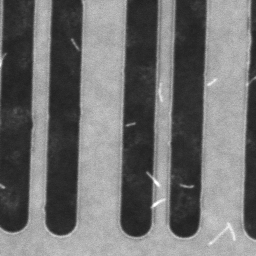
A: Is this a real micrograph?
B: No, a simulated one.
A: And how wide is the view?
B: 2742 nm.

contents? one or a few lines or trenches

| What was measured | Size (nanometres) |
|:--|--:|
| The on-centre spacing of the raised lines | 647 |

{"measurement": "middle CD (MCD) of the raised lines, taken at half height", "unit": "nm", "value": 368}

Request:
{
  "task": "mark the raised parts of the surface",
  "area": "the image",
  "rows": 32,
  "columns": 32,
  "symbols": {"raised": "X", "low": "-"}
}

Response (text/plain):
XXXX--XXXX------XXXX--XXXX-----X
XXXX--XXXX------XXXX--XXXX-----X
XXXX--XXXX------XXXX--XXXX-----X
XXXX--XXXX------XXXX--XXXX-----X
XXXX--XXXX------XXXX--XXXX-----X
XXXX--XXXX------XXXX--XXXX-----X
XXXX--XXXX------XXXX--XXXX-----X
XXXX--XXXX-----XXXXX--XXXX-----X
XXXX--XXXX-----XXXXX-XXXXX-----X
XXXX--XXXX-----XXXXX-XXXXX-----X
XXXX--XXXX-----XXXXX-XXXXX-----X
XXXX--XXXX-----XXXXX-XXXXX-----X
XXXX--XXXX-----XXXXX-XXXXX-----X
XXXX--XXXX-----XXXXX-XXXXX-----X
XXXX--XXXX-----XXXX--XXXXX-----X
XXXX--XXXX-----XXXX--XXXX------X
XXXX--XXXX-----XXXX--XXXX------X
XXXX--XXXX-----XXXX--XXXX------X
XXXX--XXXX-----XXXX--XXXX-----XX
XXXX--XXXX-----XXXX--XXXX-----XX
XXXX--XXXX-----XXXX--XXXX-----XX
XXXX--XXXX-----XXXX--XXXX-----XX
XXXX--XXXX-----XXXX--XXXX-----XX
XXXX--XXXX-----XXXX--XXXX-----XX
XXXX--XXXX-----XXXX--XXXX-----XX
XXXX-XXXXX-----XXXX--XXXX-----XX
XXXX-XXXXX-----XXXX--XXXX-----XX
XXXX--XXXX-----XXXX--XXXX-----XX
XXX---XXX------XXXX--XXXX-----XX
-------X--------XX----XX-------X
--------------------------------
--------------------------------